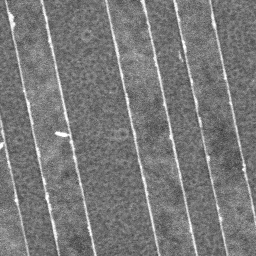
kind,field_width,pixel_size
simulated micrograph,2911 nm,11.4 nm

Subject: one or a few lines or trenches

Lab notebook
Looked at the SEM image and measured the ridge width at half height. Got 412 nm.